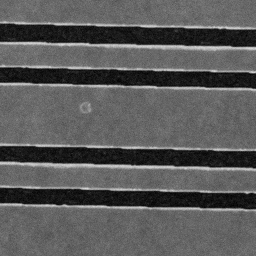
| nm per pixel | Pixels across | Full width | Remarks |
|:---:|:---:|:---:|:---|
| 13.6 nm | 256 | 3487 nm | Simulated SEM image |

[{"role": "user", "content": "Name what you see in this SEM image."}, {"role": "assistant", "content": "lines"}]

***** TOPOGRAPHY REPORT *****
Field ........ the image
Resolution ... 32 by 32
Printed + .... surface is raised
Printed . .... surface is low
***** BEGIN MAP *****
++++++++++++++++++++++++++++++++
++++++++++++++++++++++++++++++++
++++++++++++++++++++++++++++++++
............................++++
................................
+++++++++.......................
++++++++++++++++++++++++++++++++
++++++++++++++++++++++++++++++++
........++++++++++++++++++++++++
................................
+++.............................
++++++++++++++++++++++++++++++++
++++++++++++++++++++++++++++++++
++++++++++++++++++++++++++++++++
++++++++++++++++++++++++++++++++
++++++++++++++++++++++++++++++++
++++++++++++++++++++++++++++++++
++++++++++++++++++++++++++++++++
...............+++++++++++++++++
................................
++++............................
++++++++++++++++++++++++++++++++
++++++++++++++++++++++++++++++++
...+++++++++++++++++++++++++++++
................................
................................
++++++++++++++++++++++++++++++++
++++++++++++++++++++++++++++++++
++++++++++++++++++++++++++++++++
++++++++++++++++++++++++++++++++
++++++++++++++++++++++++++++++++
++++++++++++++++++++++++++++++++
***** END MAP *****